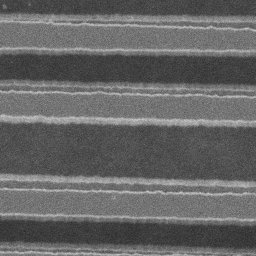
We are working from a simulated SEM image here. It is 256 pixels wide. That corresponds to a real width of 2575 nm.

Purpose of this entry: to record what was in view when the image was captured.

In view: lines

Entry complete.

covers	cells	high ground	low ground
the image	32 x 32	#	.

................................
................................
#############.#.................
################################
################################
################################
...........................#.##.
................................
................................
................................
................................
################################
################################
################################
################################
................................
................................
................................
................................
................................
................................
................................
##..............................
################################
################################
################################
################################
......................##########
................................
................................
................................
###########################.....